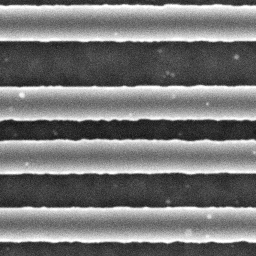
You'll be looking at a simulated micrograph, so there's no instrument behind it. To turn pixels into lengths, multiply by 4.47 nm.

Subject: lines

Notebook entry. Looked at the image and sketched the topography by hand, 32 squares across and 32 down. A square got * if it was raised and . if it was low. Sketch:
................................
********************************
********************************
********************************
********************************
................................
................................
................................
................................
................................
................................
********************************
********************************
********************************
********************************
................................
................................
................................
********************************
********************************
********************************
********************************
................................
................................
................................
................................
********************************
********************************
********************************
********************************
................................
................................